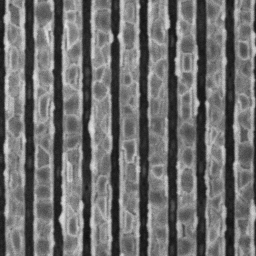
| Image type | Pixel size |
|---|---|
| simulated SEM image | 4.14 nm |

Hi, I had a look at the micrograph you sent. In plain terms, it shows parallel lines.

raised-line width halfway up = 80.7 nm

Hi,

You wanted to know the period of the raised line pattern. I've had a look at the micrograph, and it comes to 119 nanometres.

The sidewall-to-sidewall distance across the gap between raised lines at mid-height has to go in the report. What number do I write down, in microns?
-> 0.0383